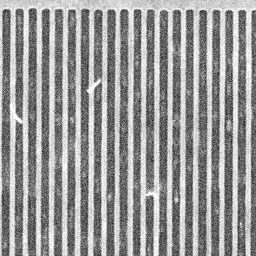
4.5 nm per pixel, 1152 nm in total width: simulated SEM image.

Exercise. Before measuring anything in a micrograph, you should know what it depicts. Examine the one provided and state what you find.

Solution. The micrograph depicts parallel lines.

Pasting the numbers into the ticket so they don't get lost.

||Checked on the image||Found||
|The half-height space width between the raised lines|42.7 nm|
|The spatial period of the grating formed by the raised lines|0.0589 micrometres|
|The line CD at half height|16.9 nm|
